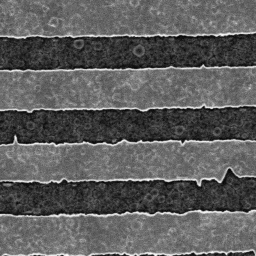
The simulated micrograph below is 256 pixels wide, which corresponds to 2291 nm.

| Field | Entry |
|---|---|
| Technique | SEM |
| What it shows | one or a few lines or trenches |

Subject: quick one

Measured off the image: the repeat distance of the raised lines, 648 nm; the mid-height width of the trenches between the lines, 32.9 px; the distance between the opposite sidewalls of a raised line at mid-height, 356 nm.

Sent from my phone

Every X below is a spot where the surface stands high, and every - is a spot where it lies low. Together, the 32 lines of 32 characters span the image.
XXXXXXXXXXXXXXXXXXXXXXXXXXXXXXXX
XXXXXXXXXXXXXXXXXXXXXXXXXXXXXXXX
XXXXXXXXXXXXXXXXXXXXXXXXXXXXXXXX
XXXXXXXXXXXXXXXXXXXXXXXXXXXXXXXX
XXXXXXXXXXXXXXX-XXX--X--X-------
---------X----------------------
-----------------X--------------
--------------------------------
--------------------XX---XXXXXXX
XXXXXXXXXXXXXXXXXXXXXXXXXXXXXXXX
XXXXXXXXXXXXXXXXXXXXXXXXXXXXXXXX
XXXXXXXXXXXXXXXXXXXXXXXXXXXXXXXX
XXXXXXXXXXXXXXXXXXXXXXXXXXXXXXXX
XXXXXXXXXXXXXXXXXXXXXXXX--X-----
--------------------------------
--------------------------------
----------------------X---------
-----------------------------XX-
XXXXXXXXXXXXXXXXXXXXXXXXXXXXXXXX
XXXXXXXXXXXXXXXXXXXXXXXXXXXXXXXX
XXXXXXXXXXXXXXXXXXXXXXXXXXXXXXXX
XXXXXXXXXXXXXXXXXXXXXXXXXXXX-XXX
XXXXXXXXXXXXXXXXXXX-XXX-X--X----
--------------------------------
--------------------------------
--------------------------------
-----------------------XXXX-XXXX
XXXXXXXXXXXXXXXXXXXXXXXXXXXXXXXX
XXXXXXXXXXXXXXXXXXXXXXXXXXXXXXXX
XXXXXXXXXXXXXXXXXXXXXXXXXXXXXXXX
XXXXXXXXXXXXXXXXXXXXXXXXXXXXXXXX
XXXXXXXXXXXXXXXXXXXXXXXXXXXXXXX-